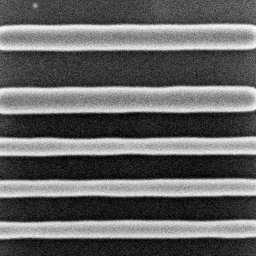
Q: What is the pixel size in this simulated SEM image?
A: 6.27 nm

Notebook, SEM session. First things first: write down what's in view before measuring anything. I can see groups of lines, slits or small figures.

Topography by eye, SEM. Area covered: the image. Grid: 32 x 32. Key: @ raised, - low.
--------------------------------
--------------------------------
--------------------------------
@@@@@@@@@@@@@@@@@@@@@@@@@@@@@@@@
@@@@@@@@@@@@@@@@@@@@@@@@@@@@@@@@
@@@@@@@@@@@@@@@@@@@@@@@@@@@@@@@@
--------------------------------
--------------------------------
--------------------------------
--------------------------------
--------------------------------
@@@@@@@@@@@@@@@@@@@@@@@@@@@@@@@@
@@@@@@@@@@@@@@@@@@@@@@@@@@@@@@@@
@@@@@@@@@@@@@@@@@@@@@@@@@@@@@@@@
--------------------------------
--------------------------------
--------------------------------
@@@@@@@@@@@@@@@@@@@@@@@@@@@@@@@@
@@@@@@@@@@@@@@@@@@@@@@@@@@@@@@@@
--------------------------------
--------------------------------
--------------------------------
-------------------@@@@@@@@@@@@@
@@@@@@@@@@@@@@@@@@@@@@@@@@@@@@@@
@@@@-@@@------@@-----@@---------
--------------------------------
--------------------------------
--------------------------------
@@@@@@@@@@@@@@@@@@@@@@@@@@@@@@@@
@@@@@@@@@@@@@@@@@@@@@@@@@@@@@@@@
--------------------------------
--------------------------------